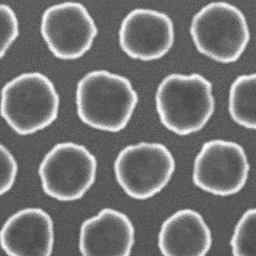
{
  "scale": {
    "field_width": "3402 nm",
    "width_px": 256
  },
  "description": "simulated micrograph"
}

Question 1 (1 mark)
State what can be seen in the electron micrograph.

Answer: a regular array of raised bodies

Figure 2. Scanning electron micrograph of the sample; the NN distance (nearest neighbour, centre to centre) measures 76 pixels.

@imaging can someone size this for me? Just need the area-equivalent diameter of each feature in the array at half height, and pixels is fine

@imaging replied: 54.7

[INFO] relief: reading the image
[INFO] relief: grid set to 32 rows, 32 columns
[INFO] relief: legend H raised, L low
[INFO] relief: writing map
LLLLLLLLLLLLLLLLLLLLLLLLLLLLLLLL
HLLLLLHHHHHLLLLLLHHLLLLLLHHHHHLL
HHLLLHHHHHHLLLLLHHHHHLLLHHHHHHLL
HHLLLHHHHHHHLLLHHHHHHLLLHHHHHHHL
HHLLLLHHHHHHLLLHHHHHHLLLHHHHHHHL
HLLLLLHHHHHLLLLHHHHHHLLLLHHHHHHL
LLLLLLLHHHLLLLLLHHHHHLLLLHHHHHLL
LLLLLLLLLLLLLLLLLLLLLLLLLLLHHLLL
LLLLLLLLLLLLLLLLLLLLLLLLLLLLLLLL
LLLHHLLLLLLHHHLLLLLLLLLLLLLLLLLL
LHHHHHLLLLHHHHHHLLLLHHHHHHLLLHHH
HHHHHHHLLLHHHHHHHLLLHHHHHHLLLHHH
HHHHHHHLLLHHHHHHHLLLHHHHHHLLLHHH
HHHHHHHLLLHHHHHHHLLLHHHHHHLLLHHH
LHHHHHHLLLHHHHHHLLLLHHHHHHLLLHHH
LHHHHHLLLLLHHHHHLLLLLHHHHLLLLLHH
LLLLLLLLLLLLLLLLLLLLLLHLLLLLLLLL
LLLLLLLLLLLLLLLLLLLLLLLLLLLLLLLL
LLLLLLLHHHLLLLLLHHHHLLLLLLHHHHLL
HLLLLLHHHHHLLLLHHHHHHLLLLHHHHHLL
HHLLLHHHHHHHLLLHHHHHHHLLLHHHHHHL
HHLLLHHHHHHHLLLHHHHHHLLLHHHHHHHL
HHLLLHHHHHHHLLLHHHHHHLLLHHHHHHLL
HLLLLLHHHHHLLLLLHHHHLLLLLLHHHHLL
LLLLLLLHHHLLLLLLLHLLLLLLLLLLLLLL
LLLLLLLLLLLLLLLLLLLLLLLLLLLLLLLL
LLLHHLLLLLLLLHLLLLLLLLLHLLLLLLLH
LHHHHHLLLLLHHHHHLLLLLHHHHLLLLLHH
LHHHHHLLLLHHHHHHLLLLHHHHHHLLLLHH
HHHHHHLLLLHHHHHHLLLLHHHHHHLLLHHH
HHHHHHLLLLHHHHHHLLLLHHHHHHLLLHHH
LHHHHHLLLLHHHHHHLLLLHHHHHHLLLHHH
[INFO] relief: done